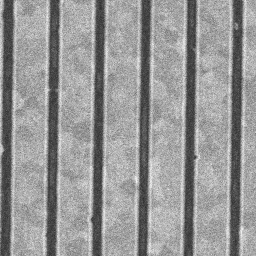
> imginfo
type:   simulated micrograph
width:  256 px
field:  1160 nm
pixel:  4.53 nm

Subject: parallel lines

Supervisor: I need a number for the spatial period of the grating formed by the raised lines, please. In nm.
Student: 207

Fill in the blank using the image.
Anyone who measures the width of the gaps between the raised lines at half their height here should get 0.0538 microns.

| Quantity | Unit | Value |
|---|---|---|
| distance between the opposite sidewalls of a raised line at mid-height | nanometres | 153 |